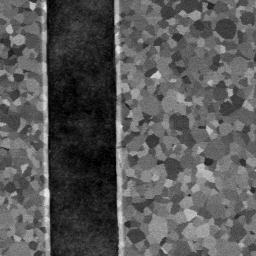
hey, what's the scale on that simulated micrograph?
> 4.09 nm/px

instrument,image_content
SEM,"one or a few lines or trenches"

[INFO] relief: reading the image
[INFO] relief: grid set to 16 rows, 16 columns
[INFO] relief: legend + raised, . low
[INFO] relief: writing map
+++....+++++++++
+++....+++++++++
+++....+++++++++
+++....+++++++++
+++....+++++++++
+++....+++++++++
+++....+++++++++
+++....+++++++++
+++....+++++++++
+++....+++++++++
+++....+++++++++
+++.....++++++++
+++.....++++++++
+++.....++++++++
+++.....++++++++
+++.....++++++++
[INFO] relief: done